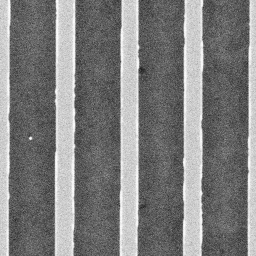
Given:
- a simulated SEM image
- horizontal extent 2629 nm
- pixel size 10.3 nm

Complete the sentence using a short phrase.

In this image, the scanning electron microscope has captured lines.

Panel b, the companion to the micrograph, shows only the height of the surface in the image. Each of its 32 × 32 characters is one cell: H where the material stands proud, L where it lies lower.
HLLLLLLHHLLLLLLHHLLLLLLHHLLLLLLH
HLLLLLLHHLLLLLLHHLLLLLLHHLLLLLLH
HLLLLLLHHLLLLLLHHLLLLLLHHLLLLLLH
HLLLLLLHHLLLLLLHHLLLLLLHHLLLLLLH
HLLLLLLHHLLLLLLHHLLLLLLHHLLLLLLH
HLLLLLLHHLLLLLLHHLLLLLLHHLLLLLLH
HLLLLLLHHLLLLLLHHLLLLLLHHLLLLLLH
HLLLLLLHHLLLLLLHHLLLLLLHHLLLLLLH
HLLLLLLHHLLLLLLHHLLLLLLHHLLLLLLH
HLLLLLLHHLLLLLLHHLLLLLLHHLLLLLLH
HLLLLLLHHLLLLLLHHLLLLLLHHLLLLLLH
HLLLLLLHHLLLLLLHHLLLLLLHHLLLLLLH
HLLLLLLHHLLLLLLHHLLLLLLHHLLLLLLH
HLLLLLLHHLLLLLLHHLLLLLLHHLLLLLLH
HLLLLLLHHLLLLLLHHLLLLLLHHLLLLLLH
HLLLLLLHHLLLLLLHHLLLLLLHHLLLLLLH
HLLLLLLHHLLLLLLHHLLLLLLHHLLLLLLH
HLLLLLLHHLLLLLLHHLLLLLLHHLLLLLLH
HLLLLLLHHLLLLLLHHLLLLLLHHLLLLLLH
HLLLLLLHHLLLLLLHHLLLLLLHHLLLLLLH
HLLLLLLHHLLLLLLHHLLLLLLHHLLLLLLH
HLLLLLLHHLLLLLLHHLLLLLLHHLLLLLLH
HLLLLLLHHLLLLLLHHLLLLLLHHLLLLLLH
HLLLLLLHHLLLLLLHHLLLLLLHHLLLLLLH
HLLLLLLHHLLLLLLHHLLLLLLHHLLLLLLH
HLLLLLLHHLLLLLLHHLLLLLLHHLLLLLLH
HLLLLLLHHLLLLLLHHLLLLLLHHLLLLLLH
HLLLLLLHHLLLLLLHHLLLLLLHHLLLLLLH
HLLLLLLHHLLLLLLHHLLLLLLHHLLLLLLH
HLLLLLLHHLLLLLLHHLLLLLLHHLLLLLLH
HLLLLLLHHLLLLLLHHLLLLLLHHLLLLLLH
HLLLLLLHHLLLLLLHHLLLLLLHHLLLLLLH